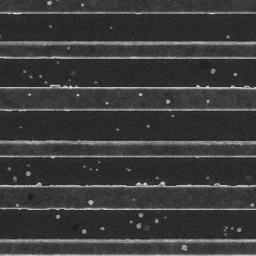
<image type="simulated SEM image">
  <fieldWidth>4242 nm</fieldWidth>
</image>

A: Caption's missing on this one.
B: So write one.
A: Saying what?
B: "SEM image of lines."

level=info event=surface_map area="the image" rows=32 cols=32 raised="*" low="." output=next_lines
********************************
********************************
................................
................................
................................
********************************
********************************
................................
................................
................................
................................
********************************
********************************
********************************
................................
................................
................................
................................
********************************
********************************
................................
................................
................................
********************************
********************************
********************************
................................
................................
................................
................................
********************************
********************************